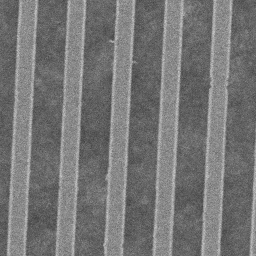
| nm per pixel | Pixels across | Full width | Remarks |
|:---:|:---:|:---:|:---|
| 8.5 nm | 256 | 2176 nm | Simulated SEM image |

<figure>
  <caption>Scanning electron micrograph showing parallel lines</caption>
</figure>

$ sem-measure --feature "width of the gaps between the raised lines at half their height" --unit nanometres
271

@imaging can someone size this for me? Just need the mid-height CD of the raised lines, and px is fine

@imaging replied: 16.7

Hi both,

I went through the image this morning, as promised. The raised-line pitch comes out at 413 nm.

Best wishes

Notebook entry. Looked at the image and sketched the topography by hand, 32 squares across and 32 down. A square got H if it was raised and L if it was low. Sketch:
LLLHHLLLLHHLLLLHHLLLLHHLLLLHHLLL
LLLHHLLLLHLLLLLHHLLLLHHLLLLHHLLL
LLHHLLLLLHLLLLLHHLLLLHHLLLLHHLLL
LLHHLLLLHHLLLLLHHLLLLHHLLLLHHLLL
LLHHLLLLHHLLLLLHHLLLLHHLLLLHHLLL
LLHHLLLLHHLLLLHHLLLLLHHLLLLHHLLL
LLHHLLLLHHLLLLHHLLLLHHHLLLLHHLLL
LLHHLLLLHHLLLLHHHLLLHHLLLLLHHLLL
LLHHLLLLHHLLLLHHLLLLHHLLLLHHLLLL
LLHHLLLLHHLLLLHHLLLLHHLLLLHHLLLL
LLHHLLLLHHLLLLHHLLLLHHLLLLHHLLLL
LLHHLLLLHHLLLLHHLLLLHHLLLLHHLLLL
LLHHLLLLHHLLLLHHLLLLHHLLLLHHLLLL
LLHHLLLLHHLLLLHHLLLLHHLLLLHHLLLL
LLHHLLLLHHLLLLHHLLLLHHLLLLHHLLLL
LLHHLLLLHHLLLLHHLLLLHHLLLLHHLLLL
LLHHLLLLHHLLLLHHLLLLHHLLLLHHLLLL
LLHHLLLLHHLLLLHHLLLLHHLLLLHHLLLL
LLHHLLLLHHLLLLHHLLLLHHLLLLHHLLLL
LLHHLLLLHHLLLLHHLLLLHHLLLLHHLLLL
LLHHLLLLHHLLLLHHLLLLHHLLLLHHLLLL
LHHHLLLLHHLLLLHHLLLLHHLLLLHHLLLL
LHHLLLLLHHLLLLHHLLLLHHLLLLHHLLLL
LHHLLLLLHHLLLLHHLLLLHHLLLLHHLLLL
LHHLLLLHHLLLLLHHLLLLHHLLLLHHLLLL
LHHLLLLHHLLLLHHHLLLLHHLLLLHHLLLL
LHHLLLLHHLLLLHHLLLLLHHLLLLHHLLLL
LHHLLLLHHLLLLHHLLLLLHLLLLHHHLLLL
LHHLLLLHHLLLLHHLLLLHHLLLLHHHLLLL
LHHLLLLHHLLLLHHLLLLHHLLLLHHLLLLL
LHHLLLLHHLLLLHHLLLLHHLLLLHHLLLLH
LHHLLLLHHLLLLHHLLLLHHLLLLHHLLLLH